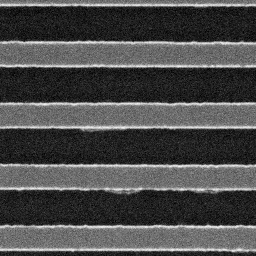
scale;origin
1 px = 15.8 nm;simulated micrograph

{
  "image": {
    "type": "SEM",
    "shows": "lines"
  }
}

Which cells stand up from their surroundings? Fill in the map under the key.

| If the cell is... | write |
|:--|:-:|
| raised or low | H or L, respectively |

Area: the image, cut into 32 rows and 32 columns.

HHHHHHHHHHHHHHHHHHHHHHHHHHHHHHHH
LLLLLLLLLLLLLLLLLLLLLLLLLLLLLLLL
LLLLLLLLLLLLLLLLLLLLLLLLLLLLLLLL
LLLLLLLLLLLLLLLLLLLLLLLLLLLLLLLL
LLLLLLLLLLLLLLLLLLLLLLLLLLLLLLLL
HHHHHHHHHHHHHHHHHHHHHHHHHHHHHHHH
HHHHHHHHHHHHHHHHHHHHHHHHHHHHHHHH
HHHHHHHHHHHHHHHHHHHHHHHHHHHHHHHH
LLLLLLLLLLLLLLLLLLLLLLLLLLLLLLLL
LLLLLLLLLLLLLLLLLLLLLLLLLLLLLLLL
LLLLLLLLLLLLLLLLLLLLLLLLLLLLLLLL
LLLLLLLLLLLLLLLLLLLLLLLLLLLLLLLL
LLLLLLLLLLLLLLLLLLLLLLLLLLLLLLLL
HHHHHHHHHHHHHHHHHHHHHHHHHHHHHHHH
HHHHHHHHHHHHHHHHHHHHHHHHHHHHHHHH
HHHHHHHHHHHHHHHHHHHHHHHHHHHHHHHH
LLLLLLLLLLLLLLLLLLLLLLLLLLLLLLLL
LLLLLLLLLLLLLLLLLLLLLLLLLLLLLLLL
LLLLLLLLLLLLLLLLLLLLLLLLLLLLLLLL
LLLLLLLLLLLLLLLLLLLLLLLLLLLLLLLL
LLLLLLLLLLLLLLLLLLLLLLLLLLLLLLLL
HHHHHHHHHHHHHHHHHHHHHHHHHHHHHHHH
HHHHHHHHHHHHHHHHHHHHHHHHHHHHHHHH
HHHHHHHHHHHHHHHHHHHHHHHHHHHHHHHH
LLLLLLLLLLLLLLLLLLLLLLLLLLLLLLLL
LLLLLLLLLLLLLLLLLLLLLLLLLLLLLLLL
LLLLLLLLLLLLLLLLLLLLLLLLLLLLLLLL
LLLLLLLLLLLLLLLLLLLLLLLLLLLLLLLL
HHHHHHHHHHHHHHHHHHHHHHHHHHHHHHHH
HHHHHHHHHHHHHHHHHHHHHHHHHHHHHHHH
HHHHHHHHHHHHHHHHHHHHHHHHHHHHHHHH
LLLLLLLLLLLLLLLLLLLLLLLLLLLLLLLL